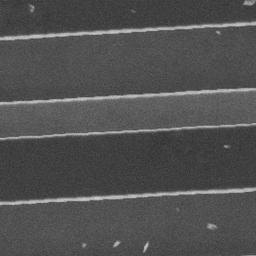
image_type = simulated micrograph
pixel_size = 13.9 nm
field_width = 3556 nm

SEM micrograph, lines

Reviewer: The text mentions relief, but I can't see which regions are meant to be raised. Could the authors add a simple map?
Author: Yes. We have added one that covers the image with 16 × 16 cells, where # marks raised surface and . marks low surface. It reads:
################
###############.
................
................
................
................
................
................
..##############
################
################
################
####............
................
................
................